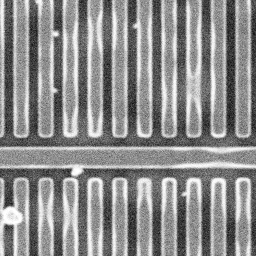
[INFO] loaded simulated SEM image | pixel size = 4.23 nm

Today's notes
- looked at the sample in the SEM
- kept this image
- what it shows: groups of lines, slits or small figures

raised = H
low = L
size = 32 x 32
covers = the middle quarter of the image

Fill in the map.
HHHLLLHHHLLLHHHHLLLHHHLLLHHHLLLH
HHHLLLHHHLLLHHHHLLLHHHLLLHHHLLLH
HHHLLLHHHLLLHHHHLLLHHHLLLHHHLLLH
HHHLLLHHHLLLHHHHLLLHHHLLLHHHLLLH
HHHLLLHHHLLLHHHHLLLHHHLLLHHHLLLH
HHHLLLHHHLLLHHHHLLLHHHLLLHHHLLLH
HHHLLLHHHLLLHHHHLLLHHHLLLHHHLLLH
HHHLLLHHHLLLHHHHLLLHHHLLLHHHLLLH
HHHLLLHHHLLLHHHHLLLHHHLLLHHHLLLH
HHHLLLHHHLLLHHHHLLLHHHLLLHHHLLLH
HHHLLLHHHLLLHHHHLLLHHHLLLHHHLLLH
HHHLLLHHHLLLHHHHLLLHHHLLLHHHLLLH
HHHLLLHHHLLLHHHHLLLHHHLLLHHHLLLH
HHHLLLHHHLLLHHHHLLLHHHLLLHHHLLLH
HHHLLLHHHLLLHHHHLLLHHHLLLHHHLLLH
HHHLLLHHHLLLHHHHLLLHHHLLLHHHLLLH
HHHLLLHHHLLLHHHHLLLHHHLLLHHHLLLH
HHHLLLHHHLLLHHHHLLLHHHLLLHHHLLLH
LLLLLLLLLLLLLLLLLLLLLLLLLLLLLLLL
LLLLLLLLLLLLLLLLLLLLLLLLLLLLLLLL
LLLLLLLLLLLLLLLLLLLLLLLLLLLLLLLL
HHHHHHHHHHHHHHHHHHHHHHHHHHHHHHHH
HHHHHHHHHHHHHHHHHHHHHHHHHHHHHHHH
HHHHHHHHHHHHHHHHHHHHHHHHHHHHHHHH
HHHHHHHHHHHHHHHHHHHHHHHHHHHHHHHH
HHHHHHHHHHHHHHHHHHHHHHHHHHHHHHHH
LLHHLLLLLLLLLLLLLLLLLLLLLLLLLLLL
LLHLLLLLLLLLLLLLLLLLLLLLLLLLLLLL
LLLLLLLLLLLLLLLLLLLLLLLLLLLLLLLL
HHHLLLHHHLLLHHHHLLLHHLLLLHHHLLLH
HHHLLLHHHLLLHHHHLLLHHLLLLHHHLLLH
HHHLLLHHHLLLHHHLLLLHHLLLLHHHLLLH